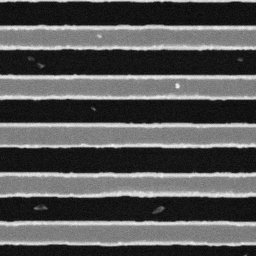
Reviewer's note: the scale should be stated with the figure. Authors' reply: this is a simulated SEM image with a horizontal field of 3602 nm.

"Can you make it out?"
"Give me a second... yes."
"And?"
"lines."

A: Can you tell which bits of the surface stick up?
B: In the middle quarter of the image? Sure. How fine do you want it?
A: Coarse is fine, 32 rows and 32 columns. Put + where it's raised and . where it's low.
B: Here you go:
................................
................................
................................
++++++++++++++++++++++++++++++++
++++++++++++++++++++++++++++++++
++++++++++++++++++++++++++++++++
++++++++++++++++++++++++++++++++
++++++++++++++++++++++++++++++++
++++++++++++++++++++++++++++++++
................................
................................
................................
................................
................................
................................
++++++++++++++++++++++++++++++++
++++++++++++++++++++++++++++++++
++++++++++++++++++++++++++++++++
++++++++++++++++++++++++++++++++
++++++++++++++++++++++++++++++++
++++++++++++++++++++++++++++++++
................................
................................
................................
................................
................................
................................
++++++.+++++++.++++++++++++++..+
++++++++++++++++++++++++++++++++
++++++++++++++++++++++++++++++++
++++++++++++++++++++++++++++++++
++++++++++++++++++++++++++++++++